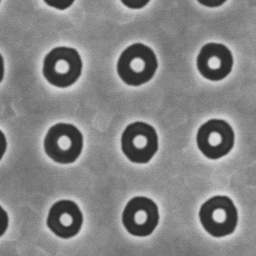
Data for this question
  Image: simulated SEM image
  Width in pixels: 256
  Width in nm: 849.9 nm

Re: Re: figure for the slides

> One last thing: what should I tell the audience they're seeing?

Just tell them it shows a regular array of ring-shaped grooves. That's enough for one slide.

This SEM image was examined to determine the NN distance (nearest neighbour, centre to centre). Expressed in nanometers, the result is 251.